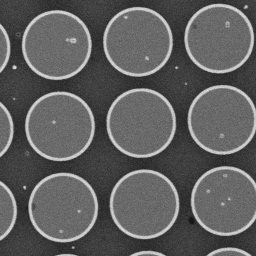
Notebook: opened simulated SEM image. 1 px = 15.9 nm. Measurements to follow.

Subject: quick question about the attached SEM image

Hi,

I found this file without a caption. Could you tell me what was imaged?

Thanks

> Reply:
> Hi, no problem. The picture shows an array of small figures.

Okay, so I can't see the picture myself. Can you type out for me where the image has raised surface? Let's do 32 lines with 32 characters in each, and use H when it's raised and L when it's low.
LLLLLLLLLLLLLLLLLLLLLLLLLLLLLLLL
LLLLLLHHLLLLLLLHHHHLLLLLLHHHHHLL
LLLLHHHHHHLLLLHHHHHHHLLLHHHHHHHL
LLLHHHHHHHHLLHHHHHHHHLLHHHHHHHHH
HLLHHHHHHHHLLHHHHHHHHLLHHHHHHHHH
HLLHHHHHHHHLLHHHHHHHHHLHHHHHHHHH
HLLHHHHHHHHLLHHHHHHHHLLHHHHHHHHL
HLLHHHHHHHHLLLHHHHHHHLLLHHHHHHHL
LLLLHHHHHHLLLLHHHHHHLLLLLHHHHHLL
LLLLLHHHHLLLLLLLLHLLLLLLLLLLLLLL
LLLLLLLLLLLLLLLLLLLLLLLLLLLLLLLL
LLLLLLLLLLLLLLLLHHHHLLLLLHHHHHLL
LLLLLHHHHHLLLLHHHHHHHLLLHHHHHHHL
HLLLHHHHHHHLLLHHHHHHHHLLHHHHHHHH
HLLHHHHHHHHHLHHHHHHHHHLHHHHHHHHH
HHLHHHHHHHHHLHHHHHHHHHLLHHHHHHHH
HHLHHHHHHHHHLHHHHHHHHHLLHHHHHHHH
HLLLHHHHHHHLLLHHHHHHHLLLHHHHHHHL
HLLLHHHHHHHLLLLHHHHHHLLLLHHHHHLL
LLLLLHHHHHLLLLLLHHHLLLLLLLLLLLLL
LLLLLLLLLLLLLLLLLLLLLLLLLLLLLLLL
LLLLLLLLLLLLLLLLHHHHLLLLLLHHHHHL
LLLLLHHHHHLLLLLHHHHHHLLLLHHHHHHH
HLLLHHHHHHHLLLHHHHHHHHLLHHHHHHHH
HHLLHHHHHHHHLLHHHHHHHHLLHHHHHHHH
HHLLHHHHHHHHLLHHHHHHHHLLHHHHHHHH
HHLLHHHHHHHHLLHHHHHHHHLLHHHHHHHH
HHLLHHHHHHHHLLHHHHHHHHLLLHHHHHHH
HHLLHHHHHHHLLLLHHHHHHLLLLHHHHHHL
HLLLLHHHHHLLLLLLHHHHLLLLLLLLLLLL
LLLLLLLLLLLLLLLLLLLLLLLLLLLLLLLL
LLLLLLLLLLLLLLLLLHHHLLLLLLLHHHHL